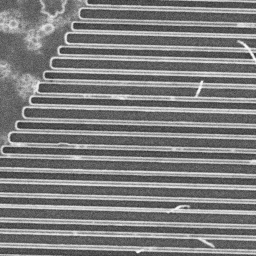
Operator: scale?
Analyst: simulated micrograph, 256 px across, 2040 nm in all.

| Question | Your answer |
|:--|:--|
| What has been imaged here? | parallel lines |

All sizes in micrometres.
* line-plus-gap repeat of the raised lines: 0.101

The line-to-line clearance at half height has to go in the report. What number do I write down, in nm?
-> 74.7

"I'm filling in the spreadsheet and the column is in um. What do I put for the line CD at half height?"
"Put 0.0339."